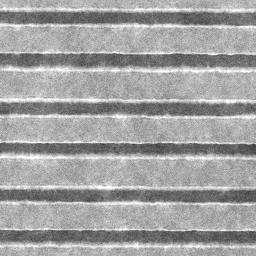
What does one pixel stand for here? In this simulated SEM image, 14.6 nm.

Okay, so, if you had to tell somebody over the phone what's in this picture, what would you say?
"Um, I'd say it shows lines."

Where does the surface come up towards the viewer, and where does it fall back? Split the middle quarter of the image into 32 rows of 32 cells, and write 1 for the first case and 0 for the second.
00000000000000000000000000000000
00000000000000001100000000000000
11111111111111111111111111111111
11111111111111111111111111111111
11111111111111111111111111111111
11111111111111111111111111111111
11111111111111111111111111111111
11111111111111111111111111111111
11111111111111111111111111111111
00000000000000000000000000000000
00000000000000000000000000000000
00000000000000000000000000000000
00000000000000000000000000000000
11111111111111111111111111111111
11111111111111111111111111111111
11111111111111111111111111111111
11111111111111111111111111111111
11111111111111111111111111111111
11111111111111111111111111111111
11111111111111111111111111111111
00000000000000000000000000000000
00000000000000000000000000000000
00000000000000000000000000000000
11111111111111111111111111111111
11111111111111111111111111111111
11111111111111111111111111111111
11111111111111111111111111111111
11111111111111111111111111111111
11111111111111111111111111111111
11111111111111111111111111111111
11111111111111111111111111111111
00000000000000000000000000000000